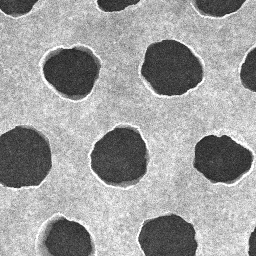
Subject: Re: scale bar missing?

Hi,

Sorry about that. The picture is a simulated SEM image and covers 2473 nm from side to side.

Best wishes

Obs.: holes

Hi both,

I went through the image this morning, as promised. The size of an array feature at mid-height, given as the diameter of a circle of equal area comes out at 534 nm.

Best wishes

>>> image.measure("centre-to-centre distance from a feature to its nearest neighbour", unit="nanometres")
952